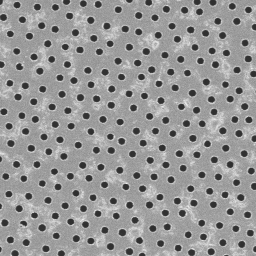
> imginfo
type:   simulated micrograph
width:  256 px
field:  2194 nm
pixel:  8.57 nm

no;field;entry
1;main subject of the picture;a regular array of holes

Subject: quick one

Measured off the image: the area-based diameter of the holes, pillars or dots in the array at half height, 0.058 µm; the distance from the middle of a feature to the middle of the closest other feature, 15.3 pixels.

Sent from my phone